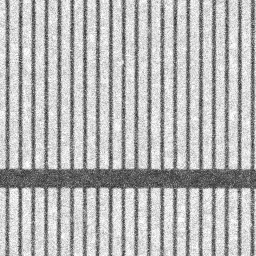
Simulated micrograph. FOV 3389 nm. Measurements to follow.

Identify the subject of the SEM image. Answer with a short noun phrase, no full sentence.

parallel lines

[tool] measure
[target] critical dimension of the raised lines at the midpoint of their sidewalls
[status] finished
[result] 109 nanometers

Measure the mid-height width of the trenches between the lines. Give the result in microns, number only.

0.0645